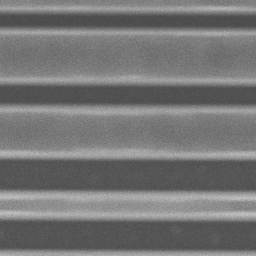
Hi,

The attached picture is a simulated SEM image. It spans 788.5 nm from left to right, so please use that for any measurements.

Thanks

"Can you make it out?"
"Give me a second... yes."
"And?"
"one or a few lines or trenches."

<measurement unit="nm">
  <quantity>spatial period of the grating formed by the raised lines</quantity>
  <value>230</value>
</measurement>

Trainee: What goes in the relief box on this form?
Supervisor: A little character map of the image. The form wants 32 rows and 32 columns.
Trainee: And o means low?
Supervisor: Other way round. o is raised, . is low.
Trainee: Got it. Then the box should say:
oooooooooooooooooooooooooooooooo
................................
................................
................................
oooooooooooooooooooooooooooooooo
oooooooooooooooooooooooooooooooo
oooooooooooooooooooooooooooooooo
oooooooooooooooooooooooooooooooo
oooooooooooooooooooooooooooooooo
oooooooooooooooooooooooooooooooo
................................
................................
................................
ooooo...........................
oooooooooooooooooooooooooooooooo
oooooooooooooooooooooooooooooooo
oooooooooooooooooooooooooooooooo
oooooooooooooooooooooooooooooooo
oooooooooooooooooooooooooooooooo
...........................ooooo
................................
................................
................................
................................
oooooooooooooooooooooooooooooooo
oooooooooooooooooooooooooooooooo
oooooooooooooooooooooooooooooooo
................................
................................
................................
................................
................................